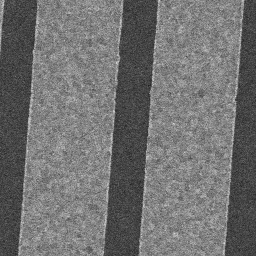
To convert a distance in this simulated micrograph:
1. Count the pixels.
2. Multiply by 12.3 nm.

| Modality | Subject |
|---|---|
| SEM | one or a few lines or trenches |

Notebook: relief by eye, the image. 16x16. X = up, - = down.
--XXXXXX--XXXXX-
--XXXXXX--XXXXX-
--XXXXXX--XXXXX-
--XXXXX---XXXXX-
--XXXXX---XXXXX-
--XXXXX--XXXXXX-
--XXXXX--XXXXXX-
--XXXXX--XXXXXX-
--XXXXX--XXXXXX-
--XXXXX--XXXXXX-
--XXXXX--XXXXX--
-XXXXXX--XXXXX--
-XXXXXX--XXXXX--
-XXXXXX--XXXXX--
-XXXXXX--XXXXX--
-XXXXXX--XXXXX--